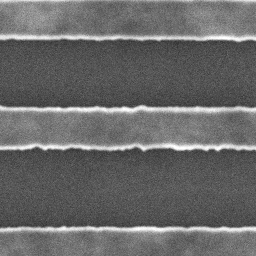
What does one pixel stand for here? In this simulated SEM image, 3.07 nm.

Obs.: lines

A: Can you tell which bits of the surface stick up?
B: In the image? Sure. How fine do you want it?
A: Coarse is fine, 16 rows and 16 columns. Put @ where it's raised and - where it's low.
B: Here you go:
@@@@@@@@@@@@@@@@
@@@@@@@@@@@@@@@@
------@-@---@-@@
----------------
----------------
----------------
----------------
@@@@@@@@@@@@@@@@
@@@@@@@@@@@@@@@@
----------------
----------------
----------------
----------------
----------------
@@@@@@@@@@@@@@@@
@@@@@@@@@@@@@@@@